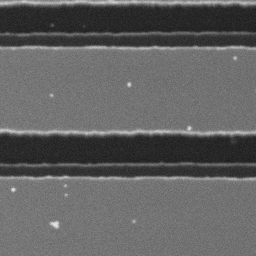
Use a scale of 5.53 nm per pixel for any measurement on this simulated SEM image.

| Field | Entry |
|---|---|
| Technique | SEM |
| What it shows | lines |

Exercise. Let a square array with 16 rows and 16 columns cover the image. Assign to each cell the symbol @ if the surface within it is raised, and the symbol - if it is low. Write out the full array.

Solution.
----------------
----------------
----------------
@@@@@@@@@@@@@@@@
@@@@@@@@@@@@@@@@
@@@@@@@@@@@@@@@@
@@@@@@@@@@@@@@@@
@@@@@@@@@@@@@@@@
----------------
----------------
----------------
@@@@@@@@@@@@@@@@
@@@@@@@@@@@@@@@@
@@@@@@@@@@@@@@@@
@@@@@@@@@@@@@@@@
@@@@@@@@@@@@@@@@